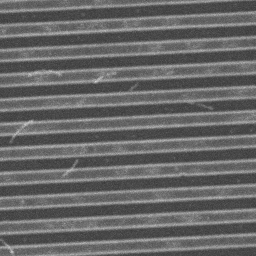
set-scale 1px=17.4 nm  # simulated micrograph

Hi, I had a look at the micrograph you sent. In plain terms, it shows parallel lines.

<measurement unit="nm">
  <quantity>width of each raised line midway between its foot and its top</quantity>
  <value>212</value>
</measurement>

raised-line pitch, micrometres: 0.427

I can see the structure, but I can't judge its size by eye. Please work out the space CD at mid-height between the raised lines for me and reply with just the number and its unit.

0.228 µm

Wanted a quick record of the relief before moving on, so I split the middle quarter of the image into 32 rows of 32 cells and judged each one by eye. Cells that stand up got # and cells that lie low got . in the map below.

...........................#####
.......#########################
################################
########################........
####...#........................
................................
.............................##.
..............##################
################################
##########################......
#######.........................
................................
...............................#
............####################
################################
#############################...
#########.......................
................................
................................
...............#...#############
################################
###############################.
###########.....................
................................
................................
.....................###########
.###############################
################################
##############..................
................................
................................
.......................#########